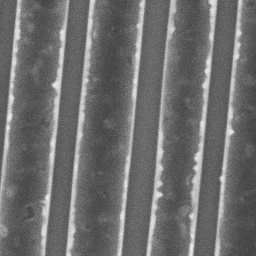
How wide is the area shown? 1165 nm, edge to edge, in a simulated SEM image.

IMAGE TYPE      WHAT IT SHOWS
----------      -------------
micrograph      one or a few lines or trenches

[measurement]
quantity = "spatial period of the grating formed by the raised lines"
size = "342 nm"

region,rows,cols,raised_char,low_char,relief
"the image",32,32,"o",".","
..oooooo...ooooooo...oooooo...oo
..oooooo...ooooooo...oooooo...oo
..oooooo...ooooooo...oooooo...oo
..oooooo...ooooooo...oooooo...oo
..oooooo...ooooooo...oooooo...oo
..oooooo...ooooooo...oooooo..ooo
..oooooo...oooooo....ooooo...ooo
..oooooo...oooooo....ooooo...ooo
..oooooo...oooooo....ooooo...ooo
.ooooooo..ooooooo...oooooo...ooo
.ooooooo..ooooooo...oooooo...ooo
.oooooo...ooooooo...oooooo...ooo
.oooooo...ooooooo...oooooo...ooo
.oooooo...ooooooo...oooooo...ooo
.oooooo...ooooooo...oooooo...ooo
.oooooo...ooooooo...oooooo..oooo
.oooooo...ooooooo...oooooo..oooo
.oooooo...oooooo....ooooo...oooo
.oooooo...oooooo....ooooo...oooo
ooooooo..ooooooo....ooooo...oooo
ooooooo..ooooooo....ooooo...oooo
oooooo...ooooooo....ooooo...oooo
oooooo...ooooooo...oooooo...oooo
oooooo...ooooooo...oooooo...oooo
oooooo...ooooooo...oooooo...oooo
oooooo...ooooooo...oooooo...oooo
oooooo...ooooooo...oooooo..ooooo
oooooo...oooooo....ooooo...ooooo
oooooo...oooooo....ooooo...ooooo
oooooo...oooooo....ooooo...ooooo
oooooo...oooooo....ooooo...ooooo
oooooo..ooooooo...oooooo...ooooo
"